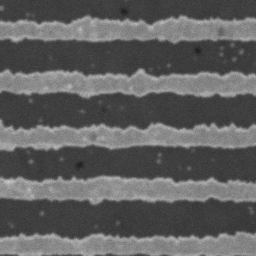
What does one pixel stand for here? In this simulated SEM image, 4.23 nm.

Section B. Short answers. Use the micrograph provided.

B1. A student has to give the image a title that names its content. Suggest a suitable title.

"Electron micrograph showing lines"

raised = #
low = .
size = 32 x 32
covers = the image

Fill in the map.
................................
................................
..........###........###..##...#
################################
################################
................................
................................
................................
................................
################.##..###########
################################
.##.##...#####.#####..##########
................................
................................
................................
................................
################################
################################
##...#..........................
................................
................................
................................
###....#.#.##########.....#.....
################################
################################
................................
................................
................................
................................
..#.#.#....##...............####
################################
################################